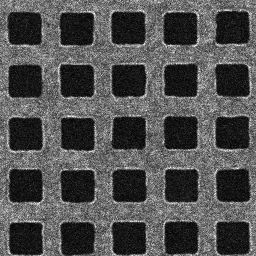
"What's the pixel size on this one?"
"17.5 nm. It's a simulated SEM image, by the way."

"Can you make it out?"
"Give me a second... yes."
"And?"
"a regular array of holes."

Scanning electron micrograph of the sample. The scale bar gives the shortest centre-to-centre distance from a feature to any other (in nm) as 905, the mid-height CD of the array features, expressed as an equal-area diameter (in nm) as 654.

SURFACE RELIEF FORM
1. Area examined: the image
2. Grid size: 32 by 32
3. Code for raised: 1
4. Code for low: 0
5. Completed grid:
11111111111111111111111111111111
11001111001111000111111111100001
10000110000011000011000001100001
10000110000011000011000001100001
10000110000011000011000001100001
10000111000111000011100011110011
11111111111111111111111111111111
11111111111111111111111111111111
10000111000011000011100001100001
10000110000011000011100001100001
10000110000011000011100001100001
10000111000011000011100001100001
11111111111111111111111111111111
11111111111111111111111111111111
11111111111111110111100011111101
10000111000011000011000001100001
10000111000011000011000001100001
10000111000011000011100001100001
10000111000011000011100011100001
11111111111111111111111111111111
11111111111111111111111111111111
10000111000011000011100001100001
10000111000011000011100001100001
10000111000011000011100001100001
10000111000011000011000001100001
11111111111111111111111111111111
11111111111111111111111111111111
11111111111111111111111111111111
10000111000011000011000001100001
10000111000011000011000001100001
10000111000011000011000001100001
10000111000011000011100001100001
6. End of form